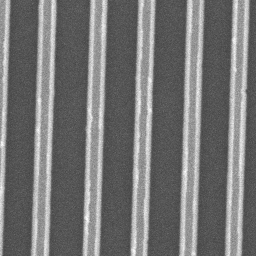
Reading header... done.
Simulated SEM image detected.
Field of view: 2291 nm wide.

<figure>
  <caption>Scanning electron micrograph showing parallel lines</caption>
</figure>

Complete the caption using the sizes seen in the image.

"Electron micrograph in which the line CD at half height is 110 nm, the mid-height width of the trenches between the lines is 318 nm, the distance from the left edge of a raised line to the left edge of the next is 432 nm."